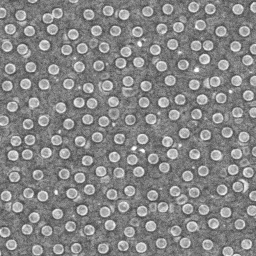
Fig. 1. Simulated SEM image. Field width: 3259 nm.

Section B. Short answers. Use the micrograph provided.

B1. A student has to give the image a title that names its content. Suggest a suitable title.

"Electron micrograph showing a regular array of raised bodies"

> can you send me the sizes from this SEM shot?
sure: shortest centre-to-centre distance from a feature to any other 0.21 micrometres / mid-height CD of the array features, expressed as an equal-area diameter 122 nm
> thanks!